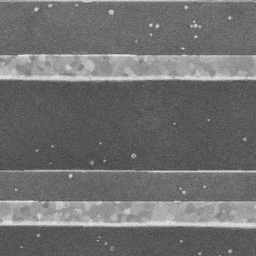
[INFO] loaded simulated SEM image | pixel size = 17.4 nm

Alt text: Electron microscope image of lines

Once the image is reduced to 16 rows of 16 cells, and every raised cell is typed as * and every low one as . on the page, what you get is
****************
****************
****************
****************
****************
................
................
................
................
................
................
****************
****************
****************
................
................